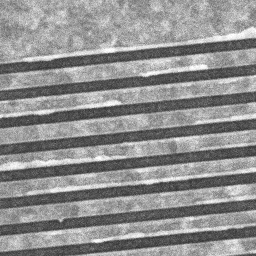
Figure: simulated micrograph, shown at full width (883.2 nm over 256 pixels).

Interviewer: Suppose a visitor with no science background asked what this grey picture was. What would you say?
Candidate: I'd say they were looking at parallel lines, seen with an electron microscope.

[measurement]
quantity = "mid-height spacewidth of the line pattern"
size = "41.2 nanometers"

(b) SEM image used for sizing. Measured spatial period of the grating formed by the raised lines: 92.5 nanometres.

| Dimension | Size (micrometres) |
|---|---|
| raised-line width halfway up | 0.0528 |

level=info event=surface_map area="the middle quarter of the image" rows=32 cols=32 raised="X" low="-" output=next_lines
-------XXXXXXXXXXXXXXXXXXXXXXXXX
XXXXXXXXXXXXXXXXXXXXXXXXXXXXXXX-
XXXXXXXXXXXXXXXXXXXXXXXX--------
XXXXXXXXXXXX--------------------
XX------------------------------
-----------------------XXXXXXXXX
--------------XXXXXXXXXXXXXXXXXX
----XXXXXXXXXXXXXXXXXXXXXXXXXXXX
XXXXXXXXXXXXXXXXXXXXXXXXXXXXXX--
XXXXXXXXXXXXXXXXXXXX------------
XXXXXXXXXXX---------------------
X-------------------------------
----------------------XXXXXXXXXX
------------XXXXXXXXXXXXXXXXXXXX
--XXXXXXXXXXXXXXXXXXXXXXXXXXXXXX
XXXXXXXXXXXXXXXXXXXXXXXXXXXX----
XXXXXXXXXXXXXXXXX---------------
XXXXXXX-------------------------
----------------------------XXXX
-------------------XXXXXXXXXXXXX
---------XXXXXXXXXXXXXXXXXXXXXXX
XXXXXXXXXXXXXXXXXXXXXXXXXXXXXXXX
XXXXXXXXXXXXXXXXXXXXXXXXX-------
XXXXXXXXXXXXXXX-----------------
XXXXXX--------------------------
---------------------------XXXXX
-----------------XXXXXXXXXXXXXXX
-------XXXXXXXXXXXXXXXXXXXXXXXXX
XXXXXXXXXXXXXXXXXXXXXXXXXXXXXXXX
XXXXXXXXXXXXXXXXXXXXXXXX--------
XXXXXXXXXXXX--------------------
XX------------------------------